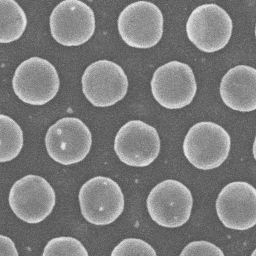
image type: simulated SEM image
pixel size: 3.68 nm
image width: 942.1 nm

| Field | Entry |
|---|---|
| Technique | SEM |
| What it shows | a regular array of raised bodies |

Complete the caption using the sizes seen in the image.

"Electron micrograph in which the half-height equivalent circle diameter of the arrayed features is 169 nm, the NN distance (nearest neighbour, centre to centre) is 249 nm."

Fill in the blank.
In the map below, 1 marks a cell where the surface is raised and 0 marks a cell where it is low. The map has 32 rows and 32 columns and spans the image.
11000000111000000110000000000000
11100001111100011111000011110000
11000011111100011111000011111000
11100011111100011111000111111000
11000001111000011111000011111000
00000000110000001110000011110000
00000000000000000000000000000000
00011000000000000000000000000000
00111110000111100000111100000110
00111110001111110001111100001111
00111110001111110001111100001111
00111110001111110001111100001111
00011100000111100000111100001111
00000000000000000000010000000111
10000000000000000000000000000000
11000001110000001100000001100000
11100011111000011111000011110000
11100011111000111111000111111000
11100011111000111111000111111000
11000011111000011111000111110000
00000000000000001100000011110000
00000000000000000000000000000000
00011100000111000000000000000000
00111100001111100001111000001111
01111110001111100001111100011111
01111110001111100011111100011111
00111100001111100001111100011111
00011000000111000001111000001111
00000000000000000000000000000110
00000000000000000000000000000000
11000011110000011100000011000000
11000111111000111110000111110000